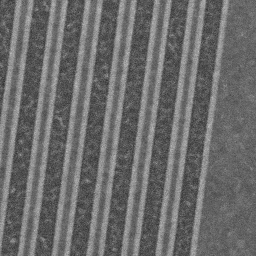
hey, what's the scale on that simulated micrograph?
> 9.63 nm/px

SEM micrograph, parallel lines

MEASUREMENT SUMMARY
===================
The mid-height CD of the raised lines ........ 124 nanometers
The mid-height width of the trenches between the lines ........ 212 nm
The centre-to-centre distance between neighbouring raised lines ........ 34.2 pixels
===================